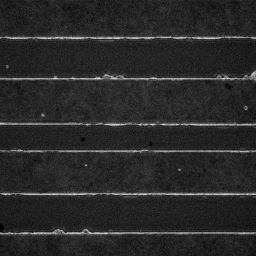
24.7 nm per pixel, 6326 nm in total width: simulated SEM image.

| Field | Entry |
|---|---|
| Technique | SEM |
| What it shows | lines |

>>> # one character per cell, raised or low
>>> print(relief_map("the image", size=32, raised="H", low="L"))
HHHHHHHHHHHHHHHHHHHHHHHHHHHHHHHH
HHHHHHHHHHHHHHHHHHHHHHHHHHHHHHHH
HHHHHHHHHHHHHHHHHHHHHHHHHHHHHHHH
HHHHHHHHHHHHHHHHHHHHHHHHHHHHHHHH
HHHHHHHHHHHHHHHHHHHHHHHHHHHHHHHH
LLLLLLLLLLLLLLLLLLLLLLLLLLLLLLLL
LLLLLLLLLLLLLLLLLLLLLLLLLLLLLLLL
LLLLLLLLLLLLLLLLLLLLLLLLLLLLLLLL
LLLLLLLLLLLLLLLLLLLLLLLLLLLLLLLL
LLLLLLLLLLLLLHLLLLLLLLLLLLLLLLLH
HHHHHHHHHHHHHHHHHHHHHHHHHHHHHHHH
HHHHHHHHHHHHHHHHHHHHHHHHHHHHHHHH
HHHHHHHHHHHHHHHHHHHHHHHHHHHHHHHH
HHHHHHHHHHHHHHHHHHHHHHHHHHHHHHHH
HHHHHHHHHHHHHHHHHHHHHHHHHHHHHHHH
LLLLLLLLLLHLLHHHLLHHHHHHHHHHHHHH
LLLLLLLLLLLLLLLLLLLLLLLLLLLLLLLL
LLLLLLLLLLLLLLLLLLLLLLLLLLLLLLLL
LLLLLLLLLLLLLLLLLLLLLLLLLLLLLLLL
HHHHHHHHHHHHHHHHHHHHHHHHHHHHHHHH
HHHHHHHHHHHHHHHHHHHHHHHHHHHHHHHH
HHHHHHHHHHHHHHHHHHHHHHHHHHHHHHHH
HHHHHHHHHHHHHHHHHHHHHHHHHHHHHHHH
HHHHHHHHHHHHHHHHHHHHHHHHHHHHHHHH
LLLLLLLLLLLLLLLLLLLLLLLLLLLLLLLL
LLLLLLLLLLLLLLLLLLLLLLLLLLLLLLLL
LLLLLLLLLLLLLLLLLLLLLLLLLLLLLLLL
LLLLLLLLLLLLLLLLLLLLLLLLLLLLLLLL
LLLLLLLLLLLLLLLLLLLLLLLLLLLLLLLL
HHHHHHHHHHHHHHHHHHHHHHHHHHHHHHHH
HHHHHHHHHHHHHHHHHHHHHHHHHHHHHHHH
HHHHHHHHHHHHHHHHHHHHHHHHHHHHHHHH